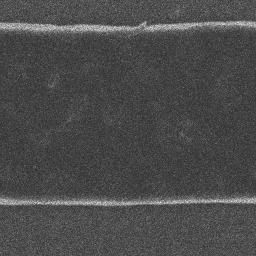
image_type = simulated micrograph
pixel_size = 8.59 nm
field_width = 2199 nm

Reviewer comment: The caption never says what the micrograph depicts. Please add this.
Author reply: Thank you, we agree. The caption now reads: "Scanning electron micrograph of one or a few lines or trenches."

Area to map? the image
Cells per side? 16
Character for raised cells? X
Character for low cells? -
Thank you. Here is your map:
----------------
------------XXX-
XXXXXXXXXXXXXXXX
XXXXXXXXXXXXXXXX
XXXXXXXXXXXXXXXX
XXXXXXXXXXXXXXXX
XXXXXXXXXXXXXXXX
XXXXXXXXXXXXXXXX
XXXXXXXXXXXXXXXX
XXXXXXXXXXXXXXXX
XXXXXXXXXXXXXXXX
XXXXXXXXXXXXXXXX
XXXXXXXXXXXXXXXX
----------------
----------------
----------------